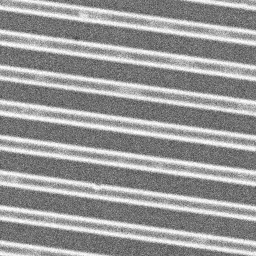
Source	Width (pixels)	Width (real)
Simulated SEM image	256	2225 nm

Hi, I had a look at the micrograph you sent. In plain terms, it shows parallel lines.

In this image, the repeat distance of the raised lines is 34.8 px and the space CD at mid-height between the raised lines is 22.9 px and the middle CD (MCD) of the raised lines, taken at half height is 103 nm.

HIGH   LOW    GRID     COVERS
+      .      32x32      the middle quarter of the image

.........................+++++++
................................
................................
++++............................
+++++++++++.....................
++++++++++++++++++..............
.....++++++++++++++++++++.......
............++++++++++++++++++++
...................+++++++++++++
..........................++++++
................................
................................
+++++++.........................
++++++++++++++..................
+++++++++++++++++++++...........
.......+++++++++++++++++++++....
...............+++++++++++++++++
....................++++++++++++
...........................+++++
................................
+...............................
++++++..........................
+++++++++++++++.................
..++++++++++++++++++++..........
.........+++++++++++++++++++....
................++++++++++++++++
.......................+++++++++
..............................++
................................
++..............................
++++++++........................
++++++++++++++++................